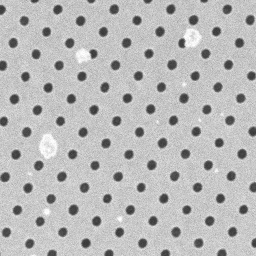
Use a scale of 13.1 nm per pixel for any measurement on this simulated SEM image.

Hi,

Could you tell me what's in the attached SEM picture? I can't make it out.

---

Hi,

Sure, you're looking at a regular array of holes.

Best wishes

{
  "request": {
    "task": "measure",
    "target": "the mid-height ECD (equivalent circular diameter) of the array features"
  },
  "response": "125 nm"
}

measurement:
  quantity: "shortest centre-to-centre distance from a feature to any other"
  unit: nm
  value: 322